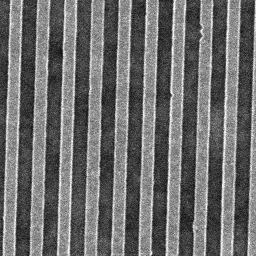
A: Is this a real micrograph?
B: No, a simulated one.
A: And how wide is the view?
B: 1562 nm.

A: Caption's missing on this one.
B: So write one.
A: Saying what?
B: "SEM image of parallel lines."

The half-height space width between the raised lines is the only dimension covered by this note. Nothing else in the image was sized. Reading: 94.5 nm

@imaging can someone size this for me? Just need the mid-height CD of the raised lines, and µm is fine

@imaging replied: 0.0694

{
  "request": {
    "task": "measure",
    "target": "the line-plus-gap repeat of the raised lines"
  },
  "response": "166 nm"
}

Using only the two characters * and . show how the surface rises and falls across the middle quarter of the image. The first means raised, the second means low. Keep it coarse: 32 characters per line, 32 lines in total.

***....**....***....***....***..
***....**....***....***....***..
**.....**....***....***....***..
**.....**....***....***....***..
**.....**....***....***....***..
**.....**....***....***....***..
**....***....***....***....***..
**....***....***....***....***..
**....***....***....***....***..
**....***....***....***....***..
**....***....***....***....**...
**....***....***....***....**...
**....***....***....***....**...
**....***....***....***....**...
**....***....***....**.....**...
**....***....***....**.....**...
**....***....***....**.....**...
**....***....***....***....**...
**....***....***....***....**...
**....***....***....**.....**...
**....***....***....**.....**...
**....***....***....**.....**...
**....***....***....**.....**...
**....***....**.....**....***...
**....***....**.....**....***...
**....***....**.....**....***...
**....***....**....***....***...
**....***....**....***....***...
**....***....**....***....***...
**....***....**....***....***...
**....***...***....***....***...
**....***...***....***....***...